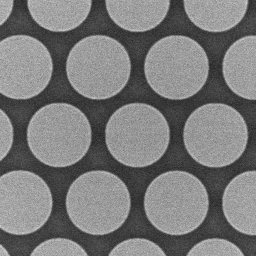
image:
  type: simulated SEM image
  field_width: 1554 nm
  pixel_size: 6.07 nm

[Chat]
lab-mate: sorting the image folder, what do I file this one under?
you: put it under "an array of small figures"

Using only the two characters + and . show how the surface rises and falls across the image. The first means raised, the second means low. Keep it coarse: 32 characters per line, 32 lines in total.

++..+++++++..++++++++..++++++++.
+...+++++++...+++++++..++++++++.
+...++++++....++++++....++++++..
......+++......++++......++++...
................................
+++++.....+++++....++++++....+++
++++++...+++++++...+++++++..++++
++++++..++++++++..++++++++..++++
++++++..++++++++..++++++++..++++
++++++..++++++++..++++++++..++++
++++++...+++++++...++++++...++++
+++++.....+++++.....+++++....+++
................................
.....++++......++++......++++...
+...+++++++...++++++....++++++..
+...+++++++..++++++++..++++++++.
++.++++++++..++++++++..++++++++.
++.++++++++..++++++++..++++++++.
+...+++++++...+++++++..++++++++.
+...++++++....++++++....++++++..
......+++.......+++......++++...
.+++.......++........++........+
+++++....++++++....++++++....+++
++++++...+++++++...+++++++..++++
++++++..++++++++..++++++++..++++
++++++..++++++++..++++++++..++++
++++++..++++++++..++++++++..++++
++++++...+++++++...++++++...++++
+++++.....+++++.....++++.....+++
................................
.....+++++.....++++......++++...
+...+++++++...++++++....++++++..